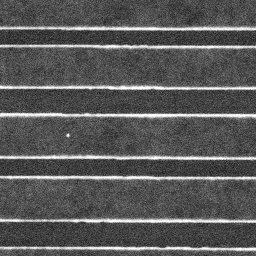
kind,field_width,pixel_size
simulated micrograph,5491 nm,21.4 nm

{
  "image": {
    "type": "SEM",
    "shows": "lines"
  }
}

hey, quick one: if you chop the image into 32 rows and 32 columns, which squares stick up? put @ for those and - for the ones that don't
@@@@@@@@@@@@@@@@@@@@@@@@@@@@@@@@
@@@@@@@@@@@@@@@@@@@@@@@@@@@@@@@@
@@@@@@@@@@@@@@@@@@@@@@@@@@@@@@@@
@@@@@@@@@@@@@@@@@@@@@@@@@@@@@@@@
--------------------------------
--------------------------------
@@@@@@@@@@@@@@@@@@@@@@@@@@@@@@@@
@@@@@@@@@@@@@@@@@@@@@@@@@@@@@@@@
@@@@@@@@@@@@@@@@@@@@@@@@@@@@@@@@
@@@@@@@@@@@@@@@@@@@@@@@@@@@@@@@@
@@@@@@@@@@@@@@@@@@@@@@@@@@@@@@@@
--------------------------------
--------------------------------
--------------------------------
@@@@@@@@@@@@@@@@@@@@@@@@@@@@@@@@
@@@@@@@@@@@@@@@@@@@@@@@@@@@@@@@@
@@@@@@@@@@@@@@@@@@@@@@@@@@@@@@@@
@@@@@@@@@@@@@@@@@@@@@@@@@@@@@@@@
@@@@@@@@@@@@@@@@@@@@@@@@@@@@@@@@
@@@@@@@@@@@@@@@@@@@@@@@@@@@@@@@@
--------------------------------
--------------------------------
@@@@@@@@@@@@@@@@@@@@@@@@@@@@@@@@
@@@@@@@@@@@@@@@@@@@@@@@@@@@@@@@@
@@@@@@@@@@@@@@@@@@@@@@@@@@@@@@@@
@@@@@@@@@@@@@@@@@@@@@@@@@@@@@@@@
@@@@@@@@@@@@@@@@@@@@@@@@@@@@@@@@
@@@@@@@@@@@@@@@@@@@@@@@@@@@@@@@@
--------------------------------
--------------------------------
--------------------------------
@@@@@@@@@@@@@@@@@@@@@@@@@@@@@@@@